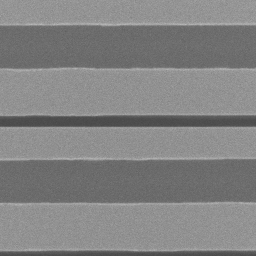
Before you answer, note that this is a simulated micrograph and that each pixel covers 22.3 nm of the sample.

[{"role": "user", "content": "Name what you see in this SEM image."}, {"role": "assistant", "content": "lines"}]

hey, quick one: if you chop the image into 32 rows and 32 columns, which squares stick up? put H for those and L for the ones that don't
HHHHHHHHHHHHHHHHHHHHHHHHHHHHHHHH
HHHHHHHHHHHHHHHHHHHHHHHHHHHHHHHH
HHHHHHHHHHHHHHHHHHHHHHHHHHHHHHHH
LLLLLLLLLLLLLLLLLLLLLLLLLLLLLLLL
LLLLLLLLLLLLLLLLLLLLLLLLLLLLLLLL
LLLLLLLLLLLLLLLLLLLLLLLLLLLLLLLL
LLLLLLLLLLLLLLLLLLLLLLLLLLLLLLLL
LLLLLLLLLLLLLLLLLLLLLLLLLLLLLLLL
LLLLLLLLLLLLLLLLLLLLLLLLLLLLLLLL
HHHHHHHHHHHHHHHHHHHHHHHHHHHHHHHH
HHHHHHHHHHHHHHHHHHHHHHHHHHHHHHHH
HHHHHHHHHHHHHHHHHHHHHHHHHHHHHHHH
HHHHHHHHHHHHHHHHHHHHHHHHHHHHHHHH
HHHHHHHHHHHHHHHHHHHHHHHHHHHHHHHH
LLLLLLLLLLLLLLLLLLLLLLLLLLLLLLLL
LLLLLLLLLLLLLLLLLLLLLLLLLLLLLLLL
HHHHHHHHHHHHHHHHHHHHHHHHHHHHHHHH
HHHHHHHHHHHHHHHHHHHHHHHHHHHHHHHH
HHHHHHHHHHHHHHHHHHHHHHHHHHHHHHHH
HHHHHHHHHHHHHHHHHHHHHHHHHHHHHHHH
LLLLLLLLLLLLLLLLLLLLLLLLLLLLLLLL
LLLLLLLLLLLLLLLLLLLLLLLLLLLLLLLL
LLLLLLLLLLLLLLLLLLLLLLLLLLLLLLLL
LLLLLLLLLLLLLLLLLLLLLLLLLLLLLLLL
LLLLLLLLLLLLLLLLLLLLLLLLLLLLLLLL
HHLHHHHHHHHHHLLLLHHHHHHHHHHHHHHH
HHHHHHHHHHHHHHHHHHHHHHHHHHHHHHHH
HHHHHHHHHHHHHHHHHHHHHHHHHHHHHHHH
HHHHHHHHHHHHHHHHHHHHHHHHHHHHHHHH
HHHHHHHHHHHHHHHHHHHHHHHHHHHHHHHH
HHHHHHHHHHHHHHHHHHHHHHHHHHHHHHHH
LLLLLLLLLLLLLLLLLLLLLLLLLLLLLLLL